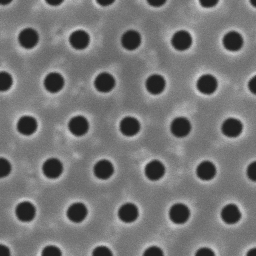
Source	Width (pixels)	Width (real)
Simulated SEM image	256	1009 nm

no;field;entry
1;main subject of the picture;a regular array of holes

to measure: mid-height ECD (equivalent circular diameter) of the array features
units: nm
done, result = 83.6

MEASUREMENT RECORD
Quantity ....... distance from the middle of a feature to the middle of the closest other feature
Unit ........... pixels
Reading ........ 49.9